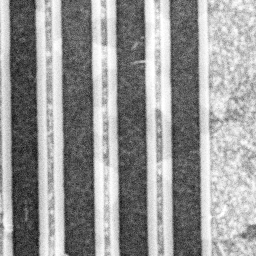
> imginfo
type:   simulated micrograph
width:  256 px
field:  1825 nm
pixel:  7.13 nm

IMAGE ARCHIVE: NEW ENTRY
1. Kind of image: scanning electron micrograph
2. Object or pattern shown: parallel lines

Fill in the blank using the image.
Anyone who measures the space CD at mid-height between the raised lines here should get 271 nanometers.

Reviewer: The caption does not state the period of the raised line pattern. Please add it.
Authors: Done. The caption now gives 388 nm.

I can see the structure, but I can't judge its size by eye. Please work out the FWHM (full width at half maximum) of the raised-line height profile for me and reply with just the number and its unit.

15.5 px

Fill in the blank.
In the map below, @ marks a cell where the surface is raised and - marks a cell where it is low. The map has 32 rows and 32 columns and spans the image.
-----@@-----@@-----@@----@@@@@@@
@----@@-----@@-----@@----@@@@@@@
@----@@-----@@-----@@----@@@@@@@
@----@@-----@@-----@@----@@@@@@@
@----@@-----@@-----@@----@@@@@@@
@----@@-----@@-----@@----@@@@@@@
@----@@-----@@-----@@----@@@@@@@
@----@@-----@@-----@@----@@@@@@@
@----@@-----@@-----@@-----@@@@@@
@----@@-----@@-----@@-----@@@@@@
@----@@-----@@-----@@-----@@@@@@
@----@@-----@@-----@@-----@@@@@@
@----@@-----@@-----@@-----@@@@@@
@----@@-----@@-----@@-----@@@@@@
@----@@-----@@-----@@-----@@@@@@
@----@@-----@@-----@@-----@@@@@@
@----@@-----@@-----@@-----@@@@@@
@----@@-----@@-----@@-----@@@@@@
@----@@-----@@-----@@-----@@@@@@
@----@@-----@@-----@@-----@@@@@@
@----@@-----@@-----@@-----@@@@@@
@----@@-----@@-----@@-----@@@@@@
@----@@-----@@-----@@-----@@@@@@
@----@@-----@@-----@@-----@@@@@@
@----@@-----@@-----@@-----@@@@@@
@----@@-----@@-----@@-----@@@@@@
@----@@-----@@-----@@-----@@@@@@
@----@@------@-----@@-----@@@@@@
@----@@------@-----@@-----@@@@@@
@----@@------@-----@@-----@@@@@@
@-----@------@-----@@-----@@@@@@
@-----@------@-----@@-----@@@@@@